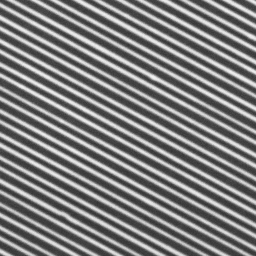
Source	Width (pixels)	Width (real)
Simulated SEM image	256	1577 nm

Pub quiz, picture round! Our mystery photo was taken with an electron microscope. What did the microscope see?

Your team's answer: parallel lines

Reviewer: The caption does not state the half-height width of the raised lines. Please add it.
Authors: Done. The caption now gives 0.0217 µm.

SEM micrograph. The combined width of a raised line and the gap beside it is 63.1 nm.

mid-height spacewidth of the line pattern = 43.4 nm